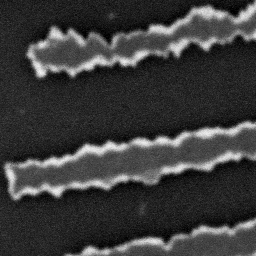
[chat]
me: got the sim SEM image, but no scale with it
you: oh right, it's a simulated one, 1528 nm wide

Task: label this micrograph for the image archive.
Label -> one or a few lines or trenches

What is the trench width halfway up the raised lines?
489 nm